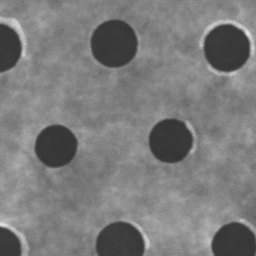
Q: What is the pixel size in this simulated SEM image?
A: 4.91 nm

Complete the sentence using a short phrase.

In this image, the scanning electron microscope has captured holes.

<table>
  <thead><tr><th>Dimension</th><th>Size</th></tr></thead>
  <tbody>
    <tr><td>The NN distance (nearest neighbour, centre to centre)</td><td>542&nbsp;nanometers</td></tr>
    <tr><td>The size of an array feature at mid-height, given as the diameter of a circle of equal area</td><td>225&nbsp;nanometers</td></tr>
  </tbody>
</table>